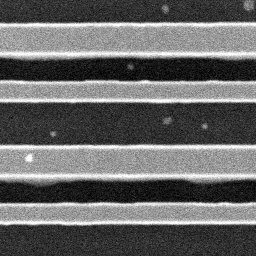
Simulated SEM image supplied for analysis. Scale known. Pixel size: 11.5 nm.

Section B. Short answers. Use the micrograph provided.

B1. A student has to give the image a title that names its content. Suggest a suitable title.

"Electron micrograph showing lines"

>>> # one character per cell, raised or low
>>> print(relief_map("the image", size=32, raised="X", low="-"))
--------------------------------
--------------------------------
--------------------------------
XXXXXXXXXXXXXXXXXXXXXXXXXXXXXXXX
XXXXXXXXXXXXXXXXXXXXXXXXXXXXXXXX
XXXXXXXXXXXXXXXXXXXXXXXXXXXXXXXX
XXXXXXXXXXXXXXXXXXXXXXXXXXXXXXXX
--------------------------------
--------------------------------
--------------------------------
XXXXXXXXXXXXXXXXXXXXXXXXXXXXXXXX
XXXXXXXXXXXXXXXXXXXXXXXXXXXXXXXX
XXXXXXXXXXXXXXXXXXXXXXXXXXXXXXXX
--------------------------------
--------------------------------
--------------------------------
--------------------------------
--------------------------------
XXXXXXXXXXXXXXXXXXXXXXXXXXXXXXXX
XXXXXXXXXXXXXXXXXXXXXXXXXXXXXXXX
XXXXXXXXXXXXXXXXXXXXXXXXXXXXXXXX
XXXXXXXXXXXXXXXXXXXXXXXXXXXXXXXX
--------------------------------
--------------------------------
--------------------------------
-------XXX--XX---XXXXXXXXX-XX--X
XXXXXXXXXXXXXXXXXXXXXXXXXXXXXXXX
XXXXXXXXXXXXXXXXXXXXXXXXXXXXXXXX
--------------------------------
--------------------------------
--------------------------------
--------------------------------